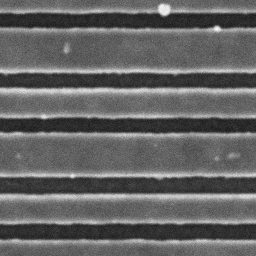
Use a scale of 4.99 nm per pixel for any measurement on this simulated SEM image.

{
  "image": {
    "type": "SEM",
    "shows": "lines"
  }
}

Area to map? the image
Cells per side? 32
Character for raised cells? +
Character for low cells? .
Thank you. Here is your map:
++++++++++++++++++++++++++++++++
++++++++++++++++++++++++++++++++
................................
..........................++....
++++++++++++++++++++++++++++++++
++++++++++++++++++++++++++++++++
++++++++++++++++++++++++++++++++
++++++++++++++++++++++++++++++++
++++++++++++++++++++++++++++++++
................................
................................
++++++++++++++++++++++++++++++++
++++++++++++++++++++++++++++++++
++++++++++++++++++++++++++++++++
++++++++++++++++++++++++++++++++
................................
................................
++++++++++++++++++++++++++++++++
++++++++++++++++++++++++++++++++
++++++++++++++++++++++++++++++++
++++++++++++++++++++++++++++++++
++++++++++++++++++++++++++++++++
................................
................................
++++++++++++++++++++++++++++++++
++++++++++++++++++++++++++++++++
++++++++++++++++++++++++++++++++
++++++++++++++++++++++++++++++++
................................
................................
++++++++++++++++++++++++++++++++
++++++++++++++++++++++++++++++++